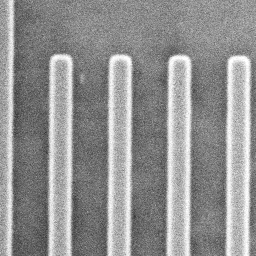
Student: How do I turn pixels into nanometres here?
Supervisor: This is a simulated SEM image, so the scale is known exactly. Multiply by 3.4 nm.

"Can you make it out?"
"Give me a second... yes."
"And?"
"groups of lines, slits or small figures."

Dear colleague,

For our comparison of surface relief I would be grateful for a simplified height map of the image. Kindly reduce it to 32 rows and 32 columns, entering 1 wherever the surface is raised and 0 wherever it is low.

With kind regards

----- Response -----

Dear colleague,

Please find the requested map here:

11000000000000000000000000000000
11000000000000000000000000000000
11000000000000000000000000000000
11000000000000000000000000000000
10000000000000000000000000000000
11000000000000000000000000000000
11000000000000000000000000000000
10000011100000110000011100000110
10000011100000110000011100000110
10000011100000110000011100000110
10000011100000110000011100000110
10000011100000110000011100000110
10000011100000110000011100000110
10000011100000110000011100000110
10000011100000110000011100000110
10000011100000110000011100000110
10000011100000110000011100000110
10000011100000110000011100000110
10000011100000110000011100000110
10000011100000110000011100000110
10000011100000110000011100000110
10000011100000110000011100000110
10000011100000110000011100000110
10000011100000110000011100000110
10000011100000110000011100000110
10000011100000110000011100000110
10000011100000110000011100000110
10000011100000110000011100000110
10000011100000110000011100000110
10000011100000110000011100000110
10000011100000110000011100001110
10000011100000110000011100001110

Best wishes